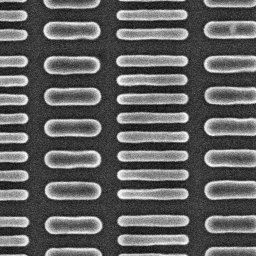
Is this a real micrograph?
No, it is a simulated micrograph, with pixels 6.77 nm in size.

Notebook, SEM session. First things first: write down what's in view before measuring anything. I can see groups of lines, slits or small figures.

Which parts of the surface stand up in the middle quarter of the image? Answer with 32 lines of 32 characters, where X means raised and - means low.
XXXXXXXXX-----------------------
XXXXXXXX------------------------
--------------------------------
--------------XXXXXXXXXXXXXXXX--
--------------XXXXXXXXXXXXXXXXX-
--------------------------------
XXXXXXXX------------------------
XXXXXXXXX-----------------------
XXXXXXXXX-----XXXXXXXXXXXXXXXXX-
XXXXXXXXX-----XXXXXXXXXXXXXXXX--
--------------------------------
--------------------------------
--------------XXXXXXXXXXXXXXXX--
-------------XXXXXXXXXXXXXXXXXX-
XXXXXXXXX-----XXXXXXXXXX-XX-----
XXXXXXXXX-----------------------
XXXXXXXXX-----------------------
XXXXXXXXX-----XXXXXXXXXXXXXXXXX-
--------------XXXXXXXXXXXXXXXXX-
--------------------------------
--------------------------------
--------------------------------
XXXXXXXX------XXXXXXXXXXXXXXXXX-
XXXXXXXXX-----XXXXXXXXXXXXXXXXX-
XXXXXXXXX-----------------------
XXX-----------------------------
--------------------------------
--------------XXXXXXXXXXXXXXXXX-
--------------XXXXXXXXXXXXXXXXX-
--------------------------------
XXXXXXXXX-----------------------
XXXXXXXXX-------------XXXXXXXX--